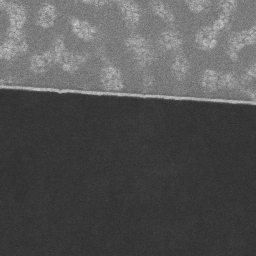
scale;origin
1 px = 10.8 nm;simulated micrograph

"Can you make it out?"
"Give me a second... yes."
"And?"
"one or a few lines or trenches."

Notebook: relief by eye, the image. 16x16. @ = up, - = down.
----------------
----------------
----------------
----------------
----------------
@@--------------
@@@@@@@@@@@@@@@@
@@@@@@@@@@@@@@@@
@@@@@@@@@@@@@@@@
@@@@@@@@@@@@@@@@
@@@@@@@@@@@@@@@@
@@@@@@@@@@@@@@@@
@@@@@@@@@@@@@@@@
@@@@@@@@@@@@@@@@
@@@@@@@@@@@@@@@@
@@@@@@@@@@@@@@@@